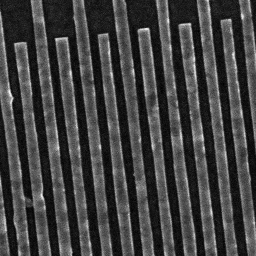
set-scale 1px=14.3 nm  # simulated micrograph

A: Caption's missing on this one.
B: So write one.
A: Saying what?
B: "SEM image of parallel lines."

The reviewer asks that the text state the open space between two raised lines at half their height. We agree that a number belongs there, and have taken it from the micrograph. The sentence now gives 148 nanometres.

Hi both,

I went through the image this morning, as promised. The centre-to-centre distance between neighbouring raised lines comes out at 296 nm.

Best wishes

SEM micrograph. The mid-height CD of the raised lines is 10.3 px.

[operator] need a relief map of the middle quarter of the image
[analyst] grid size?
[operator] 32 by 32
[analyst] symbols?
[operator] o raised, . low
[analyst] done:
oo..ooo..ooo..ooo...oo...oo...oo
oo..ooo...oo...oo...ooo..oo...oo
oo..ooo...oo...ooo..oo...oo...oo
oo..ooo...oo...ooo..ooo..ooo...o
oo..ooo...oo...ooo..ooo..ooo...o
oo...ooo..oo...ooo..ooo...oo...o
oo...ooo..ooo..ooo..ooo...oo...o
ooo..ooo..ooo..ooo..ooo...oo...o
ooo..ooo..ooo..ooo...oo...oo...o
ooo..ooo..ooo...oo...oo...oo...o
ooo..ooo...oo...oo...oo...oo...o
ooo...oo...oo...oo...ooo..ooo..o
ooo...oo...oo...oo...ooo..ooo...
ooo...oo...oo...ooo..ooo...oo...
ooo...oo...ooo..ooo..ooo...oo...
.oo...oo...ooo..ooo..ooo...oo...
.oo...ooo..ooo...oo..ooo...oo...
.oo...ooo..ooo...oo...oo...oo...
.ooo..ooo...oo...oo...oo...oo...
.ooo..ooo...oo...oo...oo...oo...
.ooo...oo...oo...oo...ooo..ooo..
..oo...oo...oo...oo...oo...ooo..
..oo...oo...oo...oo...ooo..ooo..
..oo...oo...ooo..ooo...oo..ooo..
..oo...oo...ooo..ooo...oo...oo..
..oo...ooo..ooo...oo...oo..ooo..
..oo...ooo..ooo...oo...oo...oo..
..oo...ooo..ooo...oo...oo...ooo.
..ooo...oo..ooo...oo...oo...ooo.
..ooo...oo...oo...oo...oo...ooo.
...oo...oo...ooo..oo...ooo..ooo.
...oo...oo...ooo..oo...ooo..ooo.